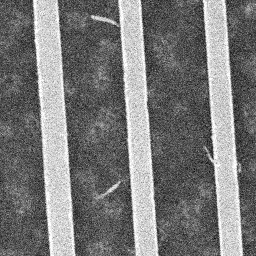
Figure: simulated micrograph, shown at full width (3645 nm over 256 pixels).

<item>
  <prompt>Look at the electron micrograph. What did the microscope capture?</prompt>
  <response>one or a few lines or trenches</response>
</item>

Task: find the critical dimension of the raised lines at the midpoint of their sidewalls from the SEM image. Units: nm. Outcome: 302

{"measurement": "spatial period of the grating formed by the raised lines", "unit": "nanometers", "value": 1200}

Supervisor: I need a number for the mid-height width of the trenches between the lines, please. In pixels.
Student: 62.6